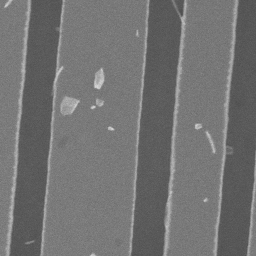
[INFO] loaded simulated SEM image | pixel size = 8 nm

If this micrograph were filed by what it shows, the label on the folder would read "lines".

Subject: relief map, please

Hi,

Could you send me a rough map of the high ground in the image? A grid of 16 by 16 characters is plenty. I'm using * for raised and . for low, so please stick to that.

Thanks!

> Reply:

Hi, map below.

**..*****..****.
**..*****..****.
**..*****..****.
**..*****..****.
**..*****..****.
*..******..***..
*..******..***..
*..******..***..
*..******..***..
*..******..***..
*..******..***..
*..******..***..
*..*****..****..
*..*****..****..
*..*****..****..
*..*****..****.*